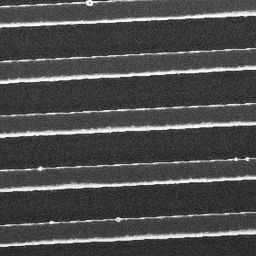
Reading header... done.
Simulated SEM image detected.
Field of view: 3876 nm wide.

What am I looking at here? lines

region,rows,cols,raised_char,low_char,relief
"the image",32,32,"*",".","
.......*************************
********************************
******************..............
................................
................................
................................
.......................*********
....****************************
********************************
****************................
................................
................................
................................
.....................***********
.*******************************
********************************
***********.....................
................................
................................
................................
...................*************
********************************
***************************.....
*******.........................
................................
................................
................................
.............*******************
********************************
***********************.........
****............................
................................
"